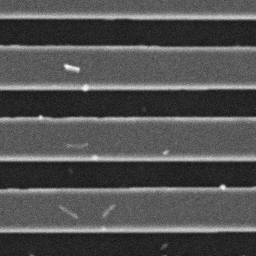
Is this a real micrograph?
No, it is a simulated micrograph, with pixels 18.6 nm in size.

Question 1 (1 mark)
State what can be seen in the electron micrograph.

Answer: lines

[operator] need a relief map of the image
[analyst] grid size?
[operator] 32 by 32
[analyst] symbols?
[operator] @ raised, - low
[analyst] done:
@@@@@@@@@@@@@@@@@@@@@@@@@@@@@@@@
@@@@@@@@@@@@@@@@@@@@@@@@@@@@@@@@
--------------------------------
--------------------------------
--------------------------------
--------------------------------
@@@@@@@@@@@@@@@@@@@@@@@@@@@@@@@@
@@@@@@@@@@@@@@@@@@@@@@@@@@@@@@@@
@@@@@@@@@@@@@@@@@@@@@@@@@@@@@@@@
@@@@@@@@@@@@@@@@@@@@@@@@@@@@@@@@
@@@@@@@@@@@@@@@@@@@@@@@@@@@@@@@@
--------------------------------
--------------------------------
--------------------------------
--------------------------------
@@@@@@@@@@@@@@@@@@@@@@@@@@@@@@@@
@@@@@@@@@@@@@@@@@@@@@@@@@@@@@@@@
@@@@@@@@@@@@@@@@@@@@@@@@@@@@@@@@
@@@@@@@@@@@@@@@@@@@@@@@@@@@@@@@@
@@@@@@@@@@@@@@@@@@@@@@@@@@@@@@@@
--------------------------------
--------------------------------
--------------------------------
---------------------------@@--@
@@@@@@@@@@@@@@@@@@@@@@@@@@@@@@@@
@@@@@@@@@@@@@@@@@@@@@@@@@@@@@@@@
@@@@@@@@@@@@@@@@@@@@@@@@@@@@@@@@
@@@@@@@@@@@@@@@@@@@@@@@@@@@@@@@@
@@@@@@@@@@@@@@@@@@@@@@@@@@@@@@@@
--------------------------------
--------------------------------
--------------------------------